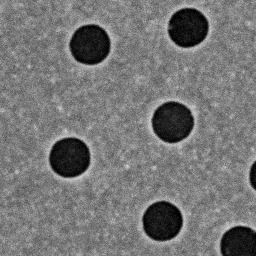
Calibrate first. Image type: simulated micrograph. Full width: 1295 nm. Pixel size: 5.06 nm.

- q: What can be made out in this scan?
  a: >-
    holes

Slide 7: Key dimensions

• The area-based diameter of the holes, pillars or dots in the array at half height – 212 nanometres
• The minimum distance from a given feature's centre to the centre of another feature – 503 nanometers